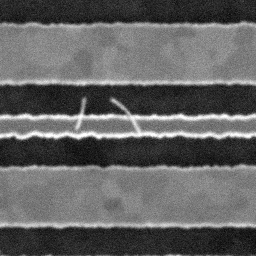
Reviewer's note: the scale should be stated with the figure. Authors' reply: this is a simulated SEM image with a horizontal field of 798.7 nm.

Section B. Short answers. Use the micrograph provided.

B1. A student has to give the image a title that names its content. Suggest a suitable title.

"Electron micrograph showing lines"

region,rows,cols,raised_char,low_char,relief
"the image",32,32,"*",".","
................................
................................
................................
********************************
********************************
********************************
********************************
********************************
********************************
********************************
..................*.............
................................
................................
................................
****.***.*********.*.**..*****.*
********************************
********************************
................................
................................
................................
................................
********************************
********************************
********************************
********************************
********************************
********************************
********************************
................................
................................
................................
................................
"